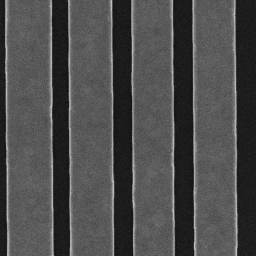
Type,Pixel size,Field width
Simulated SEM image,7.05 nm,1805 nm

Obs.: wiring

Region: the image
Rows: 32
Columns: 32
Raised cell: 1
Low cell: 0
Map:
01111100011111001111110011111000
01111100011111001111110011111000
01111100011111001111110011111000
01111100011111001111110011111000
01111100011111001111110011111000
01111100011111000111110011111000
01111100011111000111110011111000
01111100011111000111110011111000
01111100011111000111110011111000
01111100011111001111110011111000
01111110011111001111110011111000
01111110011111000111110011111100
01111110011111000111110011111100
01111110011111000111110011111100
01111110011111000111110011111100
01111110011111000111110011111100
01111110011111000111110011111100
01111110011111000111110011111100
01111110011111000111110011111100
01111110011111000111110011111100
01111110011111000111110011111100
01111110011111000111110011111100
01111110011111000111110011111100
01111110011111000111110011111100
01111110011111000111110011111100
01111110011111000111110011111100
01111110011111000111110011111100
01111110011111000111110011111100
01111110011111000111110011111100
01111110011111000111110011111100
01111110011111000111110011111100
01111110011111000111110011111100